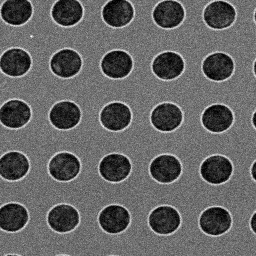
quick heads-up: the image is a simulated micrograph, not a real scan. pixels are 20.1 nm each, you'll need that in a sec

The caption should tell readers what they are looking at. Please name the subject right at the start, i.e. a regular array of holes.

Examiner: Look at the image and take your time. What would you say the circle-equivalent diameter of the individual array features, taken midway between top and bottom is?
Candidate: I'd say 0.6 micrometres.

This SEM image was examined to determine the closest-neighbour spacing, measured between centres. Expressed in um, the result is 1.02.